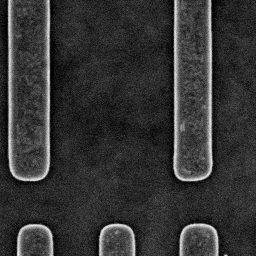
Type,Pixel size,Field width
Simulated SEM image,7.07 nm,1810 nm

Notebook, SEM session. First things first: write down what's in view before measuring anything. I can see wiring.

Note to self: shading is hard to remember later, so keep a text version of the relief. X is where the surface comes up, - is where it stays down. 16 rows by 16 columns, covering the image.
-XX--------XX---
-XX--------XX---
-XX--------XX---
-XX--------XX---
-XX--------XX---
-XX--------XX---
-XX--------XX---
-XX--------XX---
-XX--------XX---
-XX--------XX---
-XX--------XX---
----------------
----------------
----------------
-XX---XX---XX---
-XX---XX---XXX--